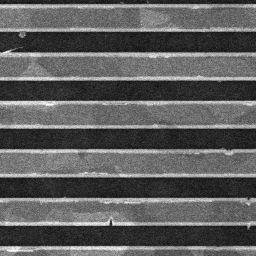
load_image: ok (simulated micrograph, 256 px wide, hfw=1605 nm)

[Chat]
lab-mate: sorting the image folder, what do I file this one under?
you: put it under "parallel lines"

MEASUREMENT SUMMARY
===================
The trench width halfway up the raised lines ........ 147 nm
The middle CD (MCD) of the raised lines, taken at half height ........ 154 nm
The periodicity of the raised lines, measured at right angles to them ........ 0.304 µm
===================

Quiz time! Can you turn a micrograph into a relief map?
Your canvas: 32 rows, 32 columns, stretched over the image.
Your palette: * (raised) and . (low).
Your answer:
................................
********************************
********************************
********************************
................................
................................
................................
********************************
********************************
********************************
................................
................................
................................
********************************
********************************
********************************
................................
................................
................................
********************************
********************************
********************************
................................
................................
................................
********************************
********************************
********************************
................................
................................
................................
********************************